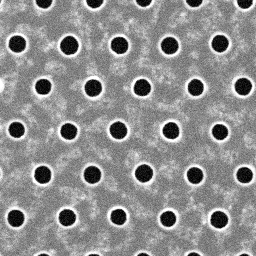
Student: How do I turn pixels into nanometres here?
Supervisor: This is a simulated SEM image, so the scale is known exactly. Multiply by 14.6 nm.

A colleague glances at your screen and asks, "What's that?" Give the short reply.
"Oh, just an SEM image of a regular array of holes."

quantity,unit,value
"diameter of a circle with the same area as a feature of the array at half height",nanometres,268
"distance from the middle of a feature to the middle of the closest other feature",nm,724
